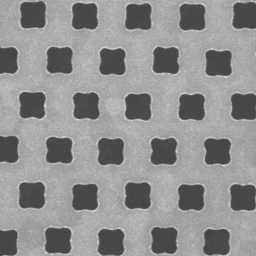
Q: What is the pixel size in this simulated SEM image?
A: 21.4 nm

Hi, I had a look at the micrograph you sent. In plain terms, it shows a regular array of holes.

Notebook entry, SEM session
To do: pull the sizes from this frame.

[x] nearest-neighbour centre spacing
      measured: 1100 nanometres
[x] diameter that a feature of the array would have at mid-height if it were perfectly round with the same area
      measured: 619 nm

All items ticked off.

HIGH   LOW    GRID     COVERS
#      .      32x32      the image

###...###...######.####..####...
###...###...####...###....###...
###...###...####...###....###...
###..####...####...####..####...
################################
################################
..####...###....###...####...###
..####...####...###...####...###
..####...###....###...####...###
################################
################################
################################
##....###...####...###....###...
##....###...####...###....###...
###...###...####...###....###...
################################
################################
..####...####..####...####..####
..####...###...####...####...###
..####...###...####...####...###
#############..####...####..####
################################
################################
##....###...####...###....###...
##....###...####...###....###...
##....###...####...###....###...
################################
################################
######..###########...##########
..####...###....###...###....###
..####...###...####...###....###
..####...###...####...###....###